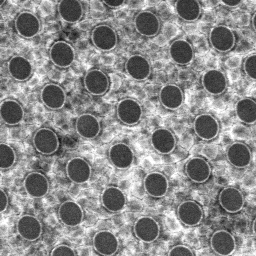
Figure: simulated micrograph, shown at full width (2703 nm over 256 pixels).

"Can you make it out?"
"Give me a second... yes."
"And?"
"a regular array of raised bodies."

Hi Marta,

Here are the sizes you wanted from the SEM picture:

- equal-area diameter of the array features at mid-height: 0.261 µm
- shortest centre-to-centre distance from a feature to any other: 462 nm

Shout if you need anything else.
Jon